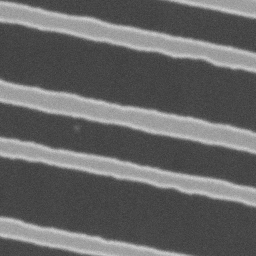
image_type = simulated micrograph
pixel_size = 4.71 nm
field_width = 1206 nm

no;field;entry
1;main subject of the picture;lines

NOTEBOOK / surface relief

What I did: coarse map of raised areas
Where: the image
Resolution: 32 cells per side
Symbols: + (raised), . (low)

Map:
++.....................+++++++++
++++++......................++++
++++++++++++....................
....+++++++++++++...............
..........+++++++++++...........
..............++++++++++++......
....................+++++++++++.
..........................++++++
.............................+++
................................
+...............................
++++++..........................
+++++++++++.....................
....+++++++++++++...............
.........+++++++++++++..........
...............++++++++++++.....
...................++++++++++++.
++......................++++++++
++++++.......................+++
++++++++++++....................
......+++++++++++...............
...........++++++++++...........
................+++++++++++.....
......................+++++++++.
..........................++++++
...............................+
................................
++..............................
++++++..........................
+++++++++++.....................
.....+++++++++++................
..........++++++++++............